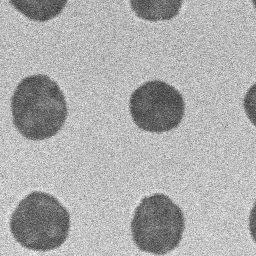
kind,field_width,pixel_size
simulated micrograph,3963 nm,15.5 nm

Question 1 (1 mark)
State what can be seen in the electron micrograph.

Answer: holes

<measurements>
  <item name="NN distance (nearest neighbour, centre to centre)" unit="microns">1.8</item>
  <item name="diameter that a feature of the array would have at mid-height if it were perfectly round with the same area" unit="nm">925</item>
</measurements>